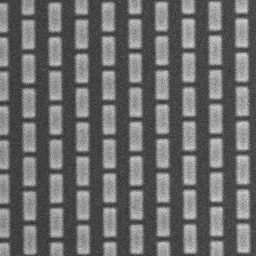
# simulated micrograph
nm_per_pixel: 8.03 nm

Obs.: groups of lines, slits or small figures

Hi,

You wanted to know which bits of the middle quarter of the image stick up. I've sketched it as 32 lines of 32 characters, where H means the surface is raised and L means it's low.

LLLHHHLLLLLLLLLLHHHLLLLLLLLLLLHH
LLLHHHLLLLLLLLLLHHHLLLLLLLLLLLHH
LLLHHHLLLLHHHLLLHHHLLLLHHHLLLLHH
LLLHHHLLLLHHHLLLHHHLLLLHHHLLLLHH
LLLHHHLLLLHHHLLLLHHLLLLHHHLLLLLL
LLLLLLLLLLHHHLLLLLLLLLLHHHLLLLLL
LLLHHHLLLLHHHLLLLHHLLLLHHHLLLLHH
LLLHHHLLLLHHHLLLLHHLLLLHHHLLLLHH
LLLHHHLLLLHHHLLLLHHLLLLHHHLLLLHH
LLLHHHLLLLLLLLLLLHHLLLLLLLLLLLHH
LLLHHHLLLLLLLLLLLHHLLLLHHHLLLLHH
LLLHHHLLLLHHHLLLLHHLLLLHHHLLLLHH
LLLHHHLLLLHHHLLLLHHLLLLHHHLLLLHH
LLLLLLLLLLHHHLLLLLLLLLLHHHLLLLLL
LLLLLLLLLLHHHLLLLLLLLLLHHHLLLLLL
LLLHHHLLLLHHHLLLLHHLLLLHHHLLLLHH
LLLHHHLLLLHHHLLLLHHLLLLHHHLLLLHH
LLLHHHLLLLLLLLLLLHHLLLLLLLLLLLHH
LLLHHHLLLLLLLLLLLHHLLLLLLLLLLLHH
LLLHHHLLLLHHHLLLLHHLLLLHHHLLLLHH
LLLHHHLLLLHHHLLLLHHLLLLHHHLLLLHH
LLLLHHLLLLHHHLLLLLLLLLLHHHLLLLLL
LLLLLLLLLLHHHLLLLLLLLLLHHHLLLLLL
LLLHHHLLLLHHHLLLLHHLLLLHHHLLLLHH
LLLHHHLLLLHHHLLLLHHLLLLHHHLLLLHH
LLLHHHLLLLHHHLLLLHHLLLLHHHLLLLHH
LLLHHHLLLLLLLLLLLHHLLLLLLLLLLLHH
LLLHHHLLLLLLLLLLLHHLLLLLLLLLLLHH
LLLHHHLLLLHHHLLLLHHLLLLHHHLLLLHH
LLLHHHLLLLHHHLLLLHHLLLLHHHLLLLHH
LLLLLLLLLLHHHLLLLLLLLLLHHHLLLLLL
LLLLLLLLLLHHHLLLLLLLLLLHHHLLLLLL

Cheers